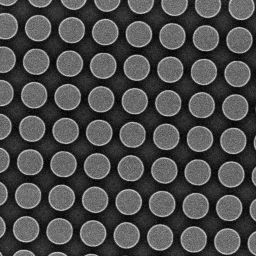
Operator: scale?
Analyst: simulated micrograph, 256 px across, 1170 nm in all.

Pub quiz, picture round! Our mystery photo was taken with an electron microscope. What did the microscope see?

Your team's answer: an array of small figures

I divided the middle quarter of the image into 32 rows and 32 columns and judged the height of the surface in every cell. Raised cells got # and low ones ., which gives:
#####..######..######...######..
####...######..######..#######..
###....#####...######...######..
.........##.....####....#####...
..........................#.....
##..............................
####...####.....###.............
####..######...#####....####....
####..######...######..######...
####..######...######..######..#
###....#####...######..######..#
........###....#####...######..#
........................####....
................................
###....####.....................
###...#####....####.....###.....
####..######..######...#####....
####..######..######...######..#
###...######..######..#######..#
##.....####....#####...######..#
................###....#####...#
................................
##.....##.......................
###...#####....###......#.......
###..######...#####....#####....
###..######...######..######...#
###..######...######..######..##
##....#####...######..######..##
.......###.....####....#####...#
........................###....#
#...............................
##....####.....##...............